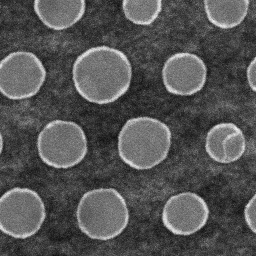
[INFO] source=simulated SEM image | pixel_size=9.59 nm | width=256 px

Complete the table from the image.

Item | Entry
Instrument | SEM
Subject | raised bodies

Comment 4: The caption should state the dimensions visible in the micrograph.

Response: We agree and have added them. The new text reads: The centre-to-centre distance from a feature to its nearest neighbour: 80.1 px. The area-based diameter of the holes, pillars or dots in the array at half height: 49 px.